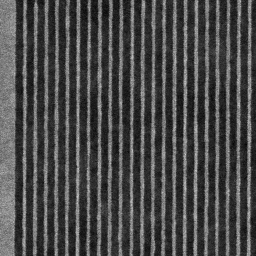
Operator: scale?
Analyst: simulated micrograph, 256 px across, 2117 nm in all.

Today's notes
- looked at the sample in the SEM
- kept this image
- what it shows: parallel lines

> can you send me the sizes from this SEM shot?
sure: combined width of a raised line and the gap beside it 88.5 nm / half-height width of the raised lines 20.7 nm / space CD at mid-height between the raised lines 67.2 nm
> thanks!